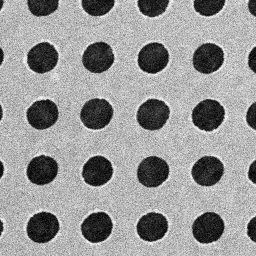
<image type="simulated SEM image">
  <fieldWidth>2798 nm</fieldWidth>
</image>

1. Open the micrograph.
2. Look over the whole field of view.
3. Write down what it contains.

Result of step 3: a regular array of holes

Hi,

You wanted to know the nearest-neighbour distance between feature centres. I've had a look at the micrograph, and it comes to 600 nm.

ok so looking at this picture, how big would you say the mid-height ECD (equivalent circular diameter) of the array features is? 346 nm